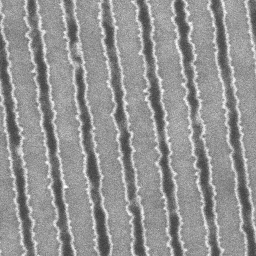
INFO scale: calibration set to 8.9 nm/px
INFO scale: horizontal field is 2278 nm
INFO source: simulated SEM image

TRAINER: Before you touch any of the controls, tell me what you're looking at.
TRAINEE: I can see parallel lines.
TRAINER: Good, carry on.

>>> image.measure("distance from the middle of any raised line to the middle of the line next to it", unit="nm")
326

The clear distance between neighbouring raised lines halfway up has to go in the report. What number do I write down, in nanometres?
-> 209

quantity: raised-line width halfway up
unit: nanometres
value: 120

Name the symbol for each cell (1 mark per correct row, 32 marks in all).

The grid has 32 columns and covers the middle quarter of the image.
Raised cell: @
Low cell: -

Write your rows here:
--@@@------@@@------@@@------@@@
--@@@------@@@@-----@@@-------@@
--@@@------@@@@-----@@@-------@@
--@@@-------@@@-----@@@@------@@
--@@@------@@@-------@@@------@@
---@@@-----@@@@------@@@------@@
---@@@------@@@-----@@@@@------@
---@@-------@@@------@@@-------@
---@@@------@@@-----@@@@@-----@@
---@@@------@@@------@@@@------@
---@@@-------@@------@@@@------@
---@@@-------@@-------@@@------@
----@@@-----@@@@------@@@@-----@
---@@@@-----@@@@------@@@------@
----@@@------@@@------@@@@-----@
----@@@------@@@-------@@@-----@
----@@@------@@@-------@@@------
----@@@-------@@@------@@@------
----@@@------@@@@------@@@-----@
----@@@@-----@@@@------@@@------
----@@@@------@@@------@@@------
-----@@@------@@@------@@@@-----
-----@@@------@@@-------@@@-----
-----@@@------@@@-------@@------
-----@@@@-----@@@------@@@@-----
-----@@@@-----@@@------@@@------
-----@@@@------@@@------@@@-----
-----@@@@------@@@------@@@@----
------@@@@-----@@@------@@@-----
------@@@------@@@------@@@@----
------@@@------@@@------@@@@----
------@@@------@@@------@@@@----